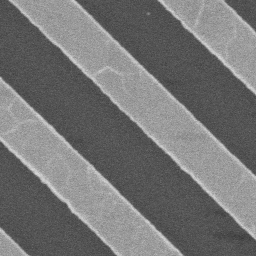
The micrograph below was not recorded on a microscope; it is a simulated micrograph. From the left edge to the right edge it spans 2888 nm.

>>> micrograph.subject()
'lines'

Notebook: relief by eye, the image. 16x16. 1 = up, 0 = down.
0111100000111100
0011110000011110
0001111000001111
0000111100000011
0000011110000001
1000001111000000
1100000111100000
1110000011110000
1111000001111000
0111100000111100
0011110000011110
0001111000001111
0000111100000111
0000011110000011
0000001111000001
1000000111100000